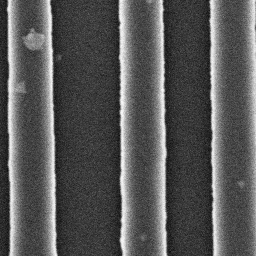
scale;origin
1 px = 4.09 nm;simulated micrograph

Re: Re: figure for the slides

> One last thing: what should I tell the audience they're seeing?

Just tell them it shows lines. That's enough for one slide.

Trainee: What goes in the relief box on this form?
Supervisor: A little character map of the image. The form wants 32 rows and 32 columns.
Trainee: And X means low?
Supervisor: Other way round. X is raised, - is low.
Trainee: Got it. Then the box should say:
-XXXXX---------XXXXX------XXXXXX
-XXXXX---------XXXXX------XXXXXX
-XXXXX---------XXXXX------XXXXXX
-XXXXX---------XXXXX------XXXXXX
-XXXXX---------XXXXX------XXXXXX
-XXXXX---------XXXXX-------XXXXX
-XXXXXX--------XXXXX------XXXXXX
-XXXXXX--------XXXXX------XXXXXX
-XXXXXX--------XXXXX-------XXXXX
-XXXXXX--------XXXXX------XXXXXX
-XXXXXX--------XXXXX-------XXXXX
-XXXXXX--------XXXXX------XXXXXX
-XXXXXX--------XXXXX-------XXXXX
-XXXXXX--------XXXXX-------XXXXX
-XXXXXX--------XXXXX-------XXXXX
-XXXXXX--------XXXXX-------XXXXX
-XXXXXX--------XXXXXX------XXXXX
-XXXXXX--------XXXXXX------XXXXX
-XXXXXX--------XXXXXX------XXXXX
-XXXXXX--------XXXXXX------XXXXX
-XXXXXX--------XXXXXX------XXXXX
-XXXXXX--------XXXXXX------XXXXX
-XXXXXX--------XXXXXX------XXXXX
-XXXXXX--------XXXXXX------XXXXX
-XXXXXX--------XXXXXX------XXXXX
-XXXXXX--------XXXXXX------XXXXX
-XXXXXX--------XXXXXX------XXXXX
-XXXXXX--------XXXXXX------XXXXX
-XXXXXX--------XXXXXX------XXXXX
-XXXXXX--------XXXXXX------XXXXX
-XXXXXX--------XXXXXX------XXXXX
-XXXXXX--------XXXXXX------XXXXX